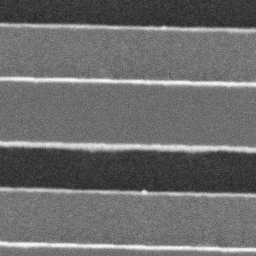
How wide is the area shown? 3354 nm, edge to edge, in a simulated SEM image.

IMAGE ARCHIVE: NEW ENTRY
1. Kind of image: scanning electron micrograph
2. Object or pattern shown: lines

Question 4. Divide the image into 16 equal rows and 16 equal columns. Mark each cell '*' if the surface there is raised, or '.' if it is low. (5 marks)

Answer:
................
................
****************
****************
****************
****************
****************
****************
****************
................
................
................
****************
****************
****************
****************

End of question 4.